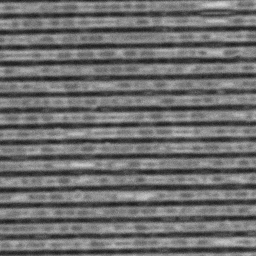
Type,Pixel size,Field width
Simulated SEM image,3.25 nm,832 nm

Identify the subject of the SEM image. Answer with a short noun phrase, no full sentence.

parallel lines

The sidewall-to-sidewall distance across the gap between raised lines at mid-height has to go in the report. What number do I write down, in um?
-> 0.0223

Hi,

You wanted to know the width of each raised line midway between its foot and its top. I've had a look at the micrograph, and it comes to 0.0284 um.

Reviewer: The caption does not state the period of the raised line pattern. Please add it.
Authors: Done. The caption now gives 51.3 nm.